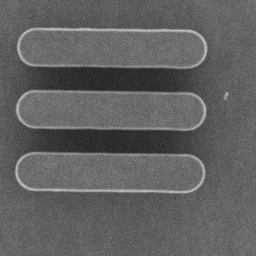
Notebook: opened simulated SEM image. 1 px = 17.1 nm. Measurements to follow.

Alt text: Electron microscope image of groups of lines, slits or small figures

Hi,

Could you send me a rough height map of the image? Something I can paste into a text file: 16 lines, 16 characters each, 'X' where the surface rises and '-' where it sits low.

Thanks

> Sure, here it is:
----------------
----------------
-XXXXXXXXXXXX---
-XXXXXXXXXXXX---
----------------
----------------
-XXXXXXXXXXXX---
-XXXXXXXXXXXX---
----------------
----------------
-XXXXXXXXXXXX---
-XXXXXXXXXXX----
----------------
----------------
----------------
----------------